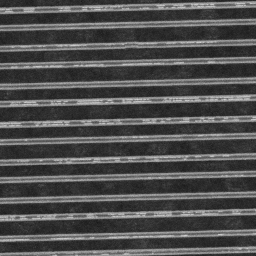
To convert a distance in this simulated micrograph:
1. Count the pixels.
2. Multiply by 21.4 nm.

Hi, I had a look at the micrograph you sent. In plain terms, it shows parallel lines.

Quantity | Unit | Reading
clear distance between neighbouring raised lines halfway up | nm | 279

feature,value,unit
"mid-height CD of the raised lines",85.8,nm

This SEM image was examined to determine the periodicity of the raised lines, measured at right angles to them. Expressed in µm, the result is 0.406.